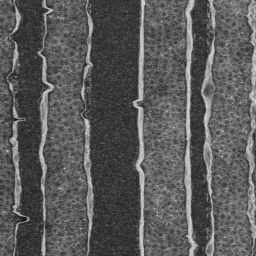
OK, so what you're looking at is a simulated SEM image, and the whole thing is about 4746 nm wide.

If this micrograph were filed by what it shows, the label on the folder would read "one or a few lines or trenches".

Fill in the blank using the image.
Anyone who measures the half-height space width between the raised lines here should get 45.2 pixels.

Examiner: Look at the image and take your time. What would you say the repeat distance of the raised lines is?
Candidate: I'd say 1570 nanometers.